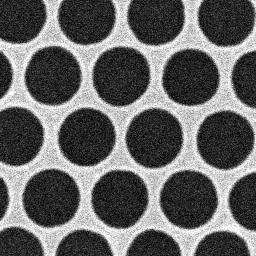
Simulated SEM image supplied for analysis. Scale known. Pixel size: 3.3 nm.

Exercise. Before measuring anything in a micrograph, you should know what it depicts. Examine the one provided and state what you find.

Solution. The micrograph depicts a regular array of holes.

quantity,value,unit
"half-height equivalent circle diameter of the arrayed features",197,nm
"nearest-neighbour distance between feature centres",227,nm